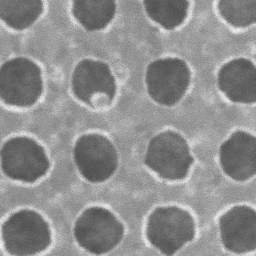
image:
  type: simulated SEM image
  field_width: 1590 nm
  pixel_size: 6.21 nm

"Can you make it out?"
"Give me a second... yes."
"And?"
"holes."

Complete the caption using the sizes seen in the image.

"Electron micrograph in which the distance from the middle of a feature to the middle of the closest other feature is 0.458 microns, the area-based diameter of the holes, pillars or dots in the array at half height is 300 nm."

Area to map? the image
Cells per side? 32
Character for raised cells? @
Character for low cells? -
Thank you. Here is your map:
-----@@@@------@@@------@@@-----
-----@@@@-----@@@@-----@@@@-----
-----@@@@@----@@@@@----@@@@@----
@---@@@@@@---@@@@@@@--@@@@@@@--@
@@@@@@@@@@@@@@@@@@@@@@@@@@@@@@@@
@@@@@@@@@@@@@@@@@@@@@@@@@@@@@@@@
@@@@@@@@@@@@@@@@@@@@@@@@@@@@@@@@
@---@@@@@@--@@@@@@@----@@@@@@--@
-----@@@@-----@@@@------@@@-----
-----@@@@-----@@@@------@@@-----
-----@@@@------@@@------@@@-----
-----@@@@------@@@-----@@@@@----
-----@@@@@--@-@@@@@----@@@@@@---
@@@@@@@@@@@@@@@@@@@@@@@@@@@@@@@@
@@@@@@@@@@@@@@@@@@@@@@@@@@@@@@@@
@@@@@@@@@@@@@@@@@@@@@@@@@@@@@@@@
@@@@@@@@@@@@@@@@@@@@--@@@@@@@--@
@---@@@@@@----@@@@@----@@@@@----
-----@@@@-----@@@@------@@@-----
------@@@------@@@------@@@-----
------@@@------@@@------@@@@----
------@@@@----@@@@@-----@@@@----
@----@@@@@@---@@@@@@@-@@@@@@@--@
@@@@@@@@@@@@@@@@@@@@@@@@@@@@@@@@
@@@@@@@@@@@@@@@@@@@@@@@@@@@@@@@@
@@@@@@@@@@@@@@@@@@@@@@@@@@@@@@-@
@@---@@@@@----@@@@@-----@@@@----
@-----@@@------@@@------@@@-----
------@@@-------@@------@@@-----
-------@@------@@@------@@@-----
@-----@@@@-----@@@@----@@@@@----
@----@@@@@@---@@@@@@--@@@@@@@--@